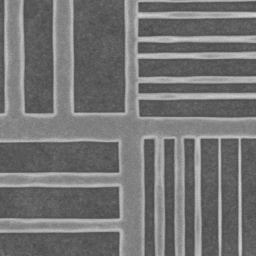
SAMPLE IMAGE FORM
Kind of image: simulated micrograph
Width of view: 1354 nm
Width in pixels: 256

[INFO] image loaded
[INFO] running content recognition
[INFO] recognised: groups of lines, slits or small figures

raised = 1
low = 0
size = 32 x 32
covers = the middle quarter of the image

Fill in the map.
11000000000000001100000000000000
11000000000000001100000000000000
11000000000000001100000000000000
11000000000000001111111111110111
11000000000000001111111111111111
11000000000000001100000000000000
11000000000000001100000000000000
11000000000000001110000011110000
11000000000000001111111111111111
11000000000000001100000000000000
11000000000000001100000000000000
11000000000000001110000000000000
11100011100000011110000000000000
11111111111111111111111111111111
11111111111111111111111111111111
11111111111111111111111111111111
11111111111111111111111111111111
11111111111111111111111111111111
11111111111111111111000111111100
00000000000001111111000110001100
00000000000000111111000110001100
00000000000000111111000110001100
00000000000000111111000110001100
00000000000000111111000110001100
00000000000000111111000110001100
00000000000000111111000110001100
00000000000000111111000110001100
11100000000001111111000110001100
11111111111111111111000110001100
11111111111111111111000110001100
11111111100000111111000110001100
00000000000000111111000110001100